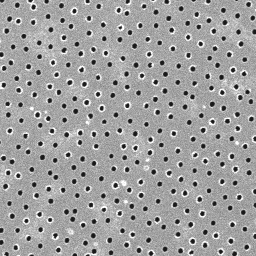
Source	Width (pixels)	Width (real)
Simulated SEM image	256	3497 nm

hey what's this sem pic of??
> a regular array of holes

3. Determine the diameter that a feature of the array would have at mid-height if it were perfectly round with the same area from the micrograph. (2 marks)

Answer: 68.9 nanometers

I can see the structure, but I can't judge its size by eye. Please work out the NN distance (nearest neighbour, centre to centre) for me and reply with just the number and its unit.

172 nm